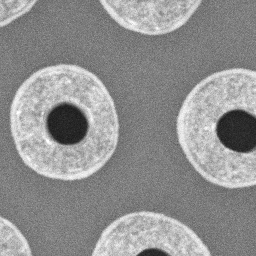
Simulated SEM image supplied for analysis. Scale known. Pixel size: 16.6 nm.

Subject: ring-shaped raised bodies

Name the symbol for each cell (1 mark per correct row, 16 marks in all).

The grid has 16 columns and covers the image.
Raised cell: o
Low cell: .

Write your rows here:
oo.....ooooo....
........ooo.....
................
................
...oo.........o.
.ooooo......oooo
.oooooo.....oooo
.oo..oo....ooo..
.oo..oo....ooo..
.oooooo.....ooo.
..oooo......oooo
..............oo
................
........oo......
o......ooooo....
oo....ooooooo...